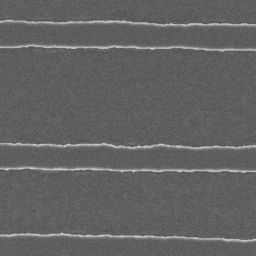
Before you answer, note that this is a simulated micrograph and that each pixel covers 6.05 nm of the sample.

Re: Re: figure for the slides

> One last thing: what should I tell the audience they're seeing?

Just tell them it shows lines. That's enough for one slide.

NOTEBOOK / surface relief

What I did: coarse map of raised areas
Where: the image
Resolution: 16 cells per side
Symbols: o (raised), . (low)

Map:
................
oooooooooooooooo
oooooooooooooooo
................
................
................
................
................
................
oooooooooooooooo
oooooooooooooooo
................
................
................
................
oooooooooooooooo